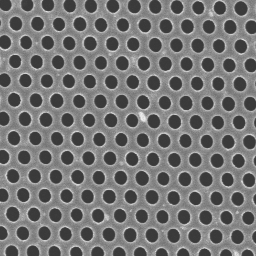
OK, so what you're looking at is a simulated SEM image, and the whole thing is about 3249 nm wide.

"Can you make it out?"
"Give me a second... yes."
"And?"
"a regular array of holes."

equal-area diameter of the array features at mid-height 13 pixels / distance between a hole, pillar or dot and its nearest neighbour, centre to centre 268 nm